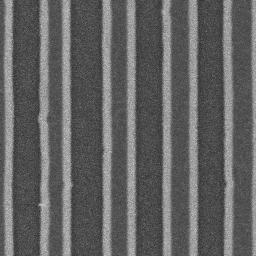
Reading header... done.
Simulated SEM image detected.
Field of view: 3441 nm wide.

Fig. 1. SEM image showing one or a few lines or trenches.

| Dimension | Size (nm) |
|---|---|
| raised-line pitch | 837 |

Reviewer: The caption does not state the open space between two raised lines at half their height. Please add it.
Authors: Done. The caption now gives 37.4 pixels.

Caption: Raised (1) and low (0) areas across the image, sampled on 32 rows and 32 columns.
10000011000001110000011100001111
10000011000001110000011100001111
10000011000000110000011100000111
10000011000001110000011100000111
10000011000001110000011100000111
10000011000001110000011100000111
10000011000001110000011100000111
10000011000001110000011100000111
10000011000001110000011100000111
10000011000001110000011100000111
10000011000001110000011100000111
10000011000000110000011100000111
10000011000001110000011100000111
10000011000001110000011100000111
10000111000001110000011100000111
10000011000001110000011100000111
10000011000000110000011100000111
10000011000000110000011100000111
10000011000000110000011100000111
10000011000001110000011100000111
10000011000001110000011100000111
10000011000001110000011100000111
10000011000001110000011100000111
10000011000001110000011100000111
10000011000001110000011100000111
10000011000001110000011100000111
10000011000001110000011100000111
10000011000001110000011100000111
10000011000001110000011100000111
10000011000001110000011100000111
10000011000001110000011100000111
10000011000000110000011100000111